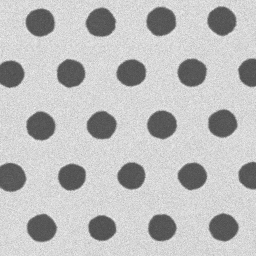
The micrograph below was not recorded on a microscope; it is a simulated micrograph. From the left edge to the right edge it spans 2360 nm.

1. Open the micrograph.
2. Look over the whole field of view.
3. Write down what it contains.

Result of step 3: a regular array of holes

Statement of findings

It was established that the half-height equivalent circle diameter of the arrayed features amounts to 265 nanometres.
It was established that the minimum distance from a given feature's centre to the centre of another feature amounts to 0.547 micrometres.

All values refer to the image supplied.